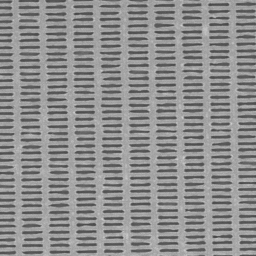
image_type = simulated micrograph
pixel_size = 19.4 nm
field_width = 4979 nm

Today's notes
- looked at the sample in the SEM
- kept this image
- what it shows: a regular array of holes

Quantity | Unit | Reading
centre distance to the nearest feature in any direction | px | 6.16